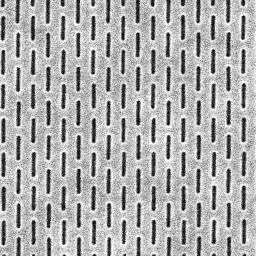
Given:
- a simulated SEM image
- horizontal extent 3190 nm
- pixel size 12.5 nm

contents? a regular array of holes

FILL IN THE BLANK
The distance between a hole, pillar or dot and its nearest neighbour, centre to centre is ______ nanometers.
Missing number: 278